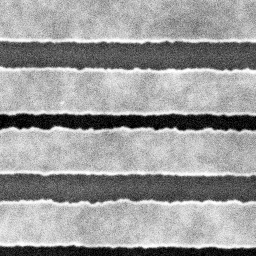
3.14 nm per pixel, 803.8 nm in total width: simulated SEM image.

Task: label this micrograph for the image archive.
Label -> lines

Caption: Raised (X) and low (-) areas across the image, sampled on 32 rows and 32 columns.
XXXXXXXXXXXXXXXXXXXXXXXXXXXXXXXX
XXXXXXXXXXXXXXXXXXXXXXXXXXXXXXXX
XXXXXXXXXXXXXXXXXXXXXXXXXXXXXXXX
XXXXXXXXXXXXXXXXXXXXXXXXXXXXXXXX
XXXXXXXXXXXXXXXXXXXXXXXXXXXXXXXX
--------------------------------
--------------------------------
--------------------------------
--------------------------------
XXXXXXXXXXXXXXXXXXXXXXXXXXXXXXXX
XXXXXXXXXXXXXXXXXXXXXXXXXXXXXXXX
XXXXXXXXXXXXXXXXXXXXXXXXXXXXXXXX
XXXXXXXXXXXXXXXXXXXXXXXXXXXXXXXX
XXXXXXXXXXXXXXXXXXXXXXXXXXXXXXXX
--------------------------------
--------------------------------
XXXXXXXXXXXXXXXXXXXXXXXXXXXXXXXX
XXXXXXXXXXXXXXXXXXXXXXXXXXXXXXXX
XXXXXXXXXXXXXXXXXXXXXXXXXXXXXXXX
XXXXXXXXXXXXXXXXXXXXXXXXXXXXXXXX
XXXXXXXXXXXXXXXXXXXXXXXXXXXXXXXX
XXXXXXXXXXXXXXXXXXXXXXXXXXXXXXXX
--------------------------------
--------------------------------
--------------------------------
XXXXXXXXXXX-XXXXXXXXXXXXXXXXXXXX
XXXXXXXXXXXXXXXXXXXXXXXXXXXXXXXX
XXXXXXXXXXXXXXXXXXXXXXXXXXXXXXXX
XXXXXXXXXXXXXXXXXXXXXXXXXXXXXXXX
XXXXXXXXXXXXXXXXXXXXXXXXXXXXXXXX
XXXXXXXXXXXXXXXXXXXXXXXXXXXXXXXX
--------------------------------